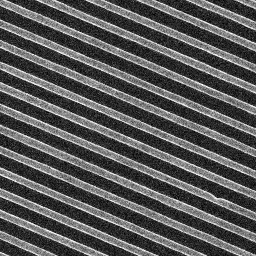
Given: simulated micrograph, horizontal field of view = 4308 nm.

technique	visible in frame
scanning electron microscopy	parallel lines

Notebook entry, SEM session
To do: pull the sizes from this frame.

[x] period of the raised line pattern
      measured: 328 nanometers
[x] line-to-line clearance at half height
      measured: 12.5 px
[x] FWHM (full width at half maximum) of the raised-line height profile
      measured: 122 nanometers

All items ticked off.